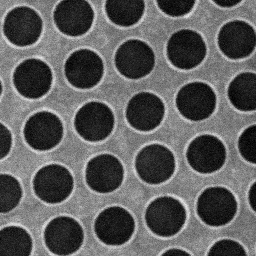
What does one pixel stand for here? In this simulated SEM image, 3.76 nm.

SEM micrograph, a regular array of holes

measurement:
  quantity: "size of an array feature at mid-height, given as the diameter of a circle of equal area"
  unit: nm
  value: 155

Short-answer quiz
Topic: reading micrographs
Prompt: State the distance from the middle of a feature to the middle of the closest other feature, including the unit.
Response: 195 nm